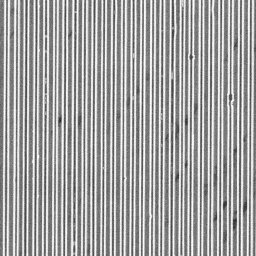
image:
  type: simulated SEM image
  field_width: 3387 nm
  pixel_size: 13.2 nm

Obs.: parallel lines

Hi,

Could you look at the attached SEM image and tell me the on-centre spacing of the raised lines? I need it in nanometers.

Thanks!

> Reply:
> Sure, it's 129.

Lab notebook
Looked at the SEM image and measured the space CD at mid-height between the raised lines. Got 77.7 nanometres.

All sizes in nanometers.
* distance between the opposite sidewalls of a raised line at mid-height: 56.2